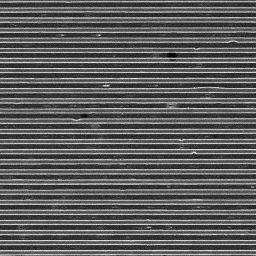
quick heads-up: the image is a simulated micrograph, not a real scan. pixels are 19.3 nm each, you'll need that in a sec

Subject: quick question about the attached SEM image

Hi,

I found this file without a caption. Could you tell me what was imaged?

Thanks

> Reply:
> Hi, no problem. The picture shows parallel lines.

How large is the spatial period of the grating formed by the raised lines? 195 nanometers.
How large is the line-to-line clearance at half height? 0.118 micrometres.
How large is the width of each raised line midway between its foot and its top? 84.3 nm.